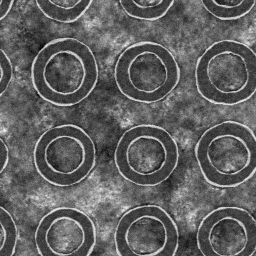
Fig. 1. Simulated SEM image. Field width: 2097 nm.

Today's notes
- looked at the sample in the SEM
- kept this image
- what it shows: ring-shaped raised bodies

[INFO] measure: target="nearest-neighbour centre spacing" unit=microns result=0.668